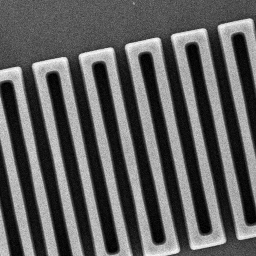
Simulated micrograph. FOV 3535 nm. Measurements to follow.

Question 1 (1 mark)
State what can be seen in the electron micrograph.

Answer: groups of lines, slits or small figures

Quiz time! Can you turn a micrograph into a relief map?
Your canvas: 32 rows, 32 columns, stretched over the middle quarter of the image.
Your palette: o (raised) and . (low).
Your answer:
o...ooo...ooo....oo....oo....oo.
o....oo....oo....oo....ooo...ooo
o....oo....oo....ooo...ooo...ooo
oo...ooo...ooo...ooo...ooo...ooo
oo...ooo...ooo...ooo...ooo...ooo
oo...ooo....oo...ooo...ooo....oo
oo....oo....oo....ooo...ooo...oo
ooo...ooo...ooo...ooo...ooo...oo
ooo...ooo...ooo...ooo...ooo...oo
ooo...ooo...ooo...ooo...ooo...oo
ooo...ooo...ooo...ooo...ooo....o
ooo....oo....oo....ooo...oo....o
.ooo...ooo...ooo...ooo...ooo...o
.ooo...ooo...ooo...ooo...ooo...o
.ooo...ooo...ooo...ooo...ooo....
.ooo....oo....oo....oo....oo....
..oo....oo....oo....ooo...ooo...
..oo....ooo...ooo...ooo...ooo...
..ooo...ooo...ooo...ooo...ooo...
..ooo...ooo...ooo...ooo...ooo...
...oo...ooo...ooo...ooo....oo...
...oo....ooo...ooo...ooo...ooo..
...ooo...ooo...ooo...ooo...ooo..
...ooo...ooo...ooo...ooo...ooo..
...ooo...ooo...ooo...ooo...ooo..
....oo...ooo...ooo....oo....oo..
....oo....oo....oo....ooo...ooo.
....ooo...ooo...ooo...ooo...ooo.
o...ooo...ooo...ooo...ooo...ooo.
o...ooo...ooo....oo....oo....oo.
o...ooo....oo....oo....oo....ooo
o....oo....oo....oo....ooo...ooo